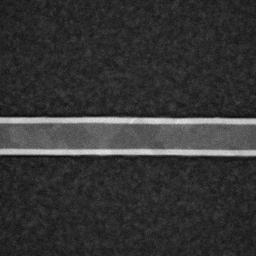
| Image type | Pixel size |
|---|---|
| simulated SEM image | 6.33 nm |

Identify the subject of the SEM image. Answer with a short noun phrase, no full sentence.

one or a few lines or trenches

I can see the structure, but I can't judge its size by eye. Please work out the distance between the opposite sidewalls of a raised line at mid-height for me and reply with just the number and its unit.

199 nm